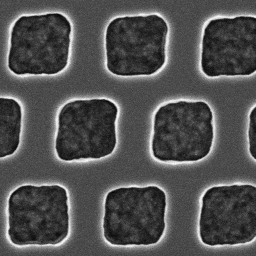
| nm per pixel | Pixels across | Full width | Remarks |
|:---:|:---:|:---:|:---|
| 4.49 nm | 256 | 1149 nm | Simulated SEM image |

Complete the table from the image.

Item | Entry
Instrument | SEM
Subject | holes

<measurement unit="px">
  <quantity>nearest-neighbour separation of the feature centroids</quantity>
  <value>96.7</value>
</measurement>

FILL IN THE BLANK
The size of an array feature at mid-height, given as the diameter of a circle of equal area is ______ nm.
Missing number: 293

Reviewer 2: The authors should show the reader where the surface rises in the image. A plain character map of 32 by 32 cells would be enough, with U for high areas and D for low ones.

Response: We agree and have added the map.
UUUUUUUUUUUUUUUUUUUUUUUUUUUUUUUU
UUUUUUUUUUUUUUUUUUUUUUUUUUUUUUUU
UUDDDDDDDUUUUUDDDDDDUUUUUUUDDDDD
UDDDDDDDDUUUUDDDDDDDDUUUUUDDDDDD
UDDDDDDDDUUUUDDDDDDDDUUUUDDDDDDD
UDDDDDDDDUUUUDDDDDDDDUUUUDDDDDDD
UDDDDDDDDUUUUDDDDDDDDUUUUDDDDDDD
UDDDDDDDUUUUUDDDDDDDDUUUUDDDDDDD
UDDDDDDDUUUUUUDDDDDDUUUUUDDDDDDD
UUUUUUUUUUUUUUUDDUUUUUUUUUDUUUUU
UUUUUUUUUUUUUUUUUUUUUUUUUUUUUUUU
UUUUUUUUUUUUUUUUUUUUUUUUUUUUUUUU
DDUUUUUUUUDDDUUUUUUUUUUUUUUUUUUU
DDDUUUUUDDDDDDDUUUUUDDDDDDUUUUUU
DDDUUUUDDDDDDDDUUUUDDDDDDDDUUUUD
DDDUUUUDDDDDDDUUUUUDDDDDDDDUUUUD
DDDUUUUDDDDDDDUUUUUDDDDDDDDUUUUD
DDUUUUUDDDDDDDDUUUUDDDDDDDDUUUUD
DDUUUUUDDDDDDDUUUUUDDDDDDDUUUUUD
DUUUUUUDDDDDDUUUUUUDDDDDDDUUUUUU
UUUUUUUUUUUUUUUUUUUUUUUUUUUUUUUU
UUUUUUUUUUUUUUUUUUUUUUUUUUUUUUUU
UUUUUUUUUUUUUUUUUUUUUUUUUUUUUUUU
UUDDDDDDUUUUUUUDDDDDUUUUUUUDDDDD
UDDDDDDDUUUUUDDDDDDDDUUUUDDDDDDD
UDDDDDDDDUUUUDDDDDDDDUUUUDDDDDDD
UDDDDDDDDUUUUDDDDDDDDUUUUDDDDDDD
UDDDDDDDDUUUUDDDDDDDDUUUUDDDDDDD
UDDDDDDDDUUUUDDDDDDDDUUUUDDDDDDD
UDDDDDDDUUUUUDDDDDDDUUUUUDDDDDDD
UUDDDDDUUUUUUUDDDDDUUUUUUUDDDDUU
UUUUUUUUUUUUUUUUUUUUUUUUUUUUUUUU